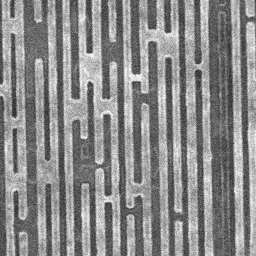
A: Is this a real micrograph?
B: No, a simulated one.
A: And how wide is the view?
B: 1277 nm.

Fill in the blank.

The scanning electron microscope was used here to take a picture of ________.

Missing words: parallel lines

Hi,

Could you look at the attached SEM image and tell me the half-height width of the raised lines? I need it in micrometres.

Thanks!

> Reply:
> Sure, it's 0.0337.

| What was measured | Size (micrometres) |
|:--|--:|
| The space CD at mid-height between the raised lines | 0.0381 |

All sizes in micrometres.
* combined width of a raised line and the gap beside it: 0.0764